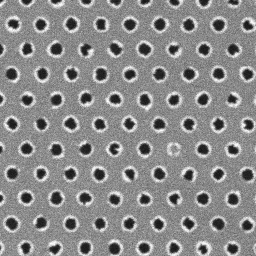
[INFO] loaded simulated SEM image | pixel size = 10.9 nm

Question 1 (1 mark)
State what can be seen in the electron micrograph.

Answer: a regular array of holes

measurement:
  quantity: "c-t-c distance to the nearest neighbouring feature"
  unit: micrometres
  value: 0.307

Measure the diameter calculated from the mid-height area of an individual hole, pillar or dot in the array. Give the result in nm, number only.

121